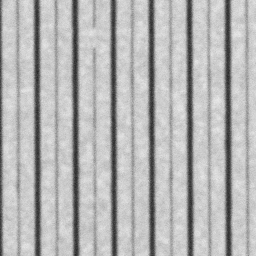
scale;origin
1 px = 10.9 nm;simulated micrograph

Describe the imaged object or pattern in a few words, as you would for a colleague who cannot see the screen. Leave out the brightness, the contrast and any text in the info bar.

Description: parallel lines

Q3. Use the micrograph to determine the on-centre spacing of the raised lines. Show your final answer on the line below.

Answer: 208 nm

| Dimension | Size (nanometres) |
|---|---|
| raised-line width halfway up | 152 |